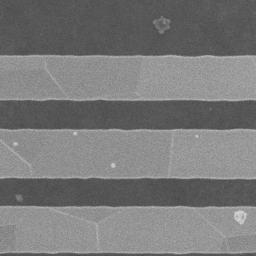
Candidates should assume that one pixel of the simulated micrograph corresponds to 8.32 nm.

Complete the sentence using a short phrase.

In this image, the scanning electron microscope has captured wiring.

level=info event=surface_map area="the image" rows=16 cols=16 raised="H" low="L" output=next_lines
LLLLLLLLLLLLLLLL
LLLLLLLLLLLLLLLL
LLLLLLLLLLLLLLLL
LLLLLLLLLLLLLLLL
HHHHHHHHHHHHHHHH
HHHHHHHHHHHHHHHH
LLLLLLLLLLLLLLLL
LLLLLLLLLLLLLLLL
HHHHHHHHHHHHHHHH
HHHHHHHHHHHHHHHH
HHHHHHHHHHHHHHHH
LLLLLLLLLLLLLLLL
LLLLLLLLLLLLLLLL
HHHHHHHHHHHHHHHH
HHHHHHHHHHHHHHHH
HHHHHHHHHHHHHHHH